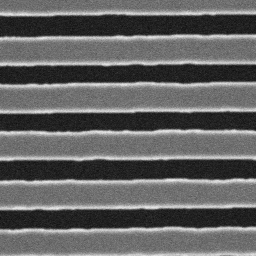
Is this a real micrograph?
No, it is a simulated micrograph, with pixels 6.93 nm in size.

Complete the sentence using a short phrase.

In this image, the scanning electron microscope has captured lines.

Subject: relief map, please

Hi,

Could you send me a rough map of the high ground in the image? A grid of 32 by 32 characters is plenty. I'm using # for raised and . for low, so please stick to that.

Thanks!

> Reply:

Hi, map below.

################################
################################
................................
................................
.....................####.######
################################
################################
################################
................................
................................
........###############.########
################################
################################
################################
................................
................................
######.##.######################
################################
################################
################################
................................
................................
....................####.....###
################################
################################
################################
................................
................................
....................###....#####
################################
################################
################################